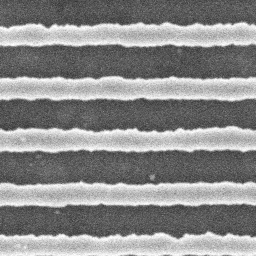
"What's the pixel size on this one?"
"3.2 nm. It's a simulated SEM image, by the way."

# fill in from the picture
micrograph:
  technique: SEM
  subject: lines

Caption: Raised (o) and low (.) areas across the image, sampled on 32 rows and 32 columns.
................................
................................
................................
oooooooooooooooooooooooooooooooo
oooooooooooooooooooooooooooooooo
oooooo..ooooo..oooooooooooooooo.
................................
................................
................................
................................
oooooooooooooooooooooooooooooooo
oooooooooooooooooooooooooooooooo
............................oo..
................................
................................
................................
ooooooooooo..ooooo...ooooooooooo
oooooooooooooooooooooooooooooooo
oooooooooooooooooooooooooooooooo
................................
................................
................................
................................
oooooooooooooooooooooooooooooooo
oooooooooooooooooooooooooooooooo
oooooooooooo.ooooooooo.oo...o..o
................................
................................
................................
...o...o..o...o.o..oo..oooo.o...
oooooooooooooooooooooooooooooooo
oooooooooooooooooooooooooooooooo